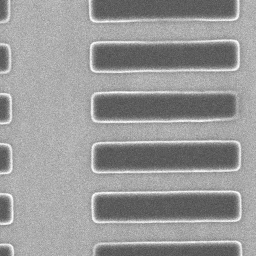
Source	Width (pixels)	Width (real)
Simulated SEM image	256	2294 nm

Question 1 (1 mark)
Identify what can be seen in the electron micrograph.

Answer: groups of lines, slits or small figures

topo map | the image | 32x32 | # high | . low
#..........###################..
#..........###################..
#...........######..............
................................
................................
............##################..
#..........###################..
#..........###################..
#..........###################..
................................
................................
............................#...
#...........##################..
#...........##################..
#...........##################..
................................
................................
................................
#...........##################..
#...........##################..
#...........##################..
#...............................
................................
................................
#...........##################..
##..........##################..
##..........##################..
##..........##################..
................................
................................
............##################..
##..........##################..